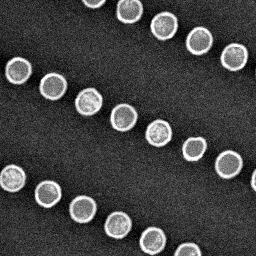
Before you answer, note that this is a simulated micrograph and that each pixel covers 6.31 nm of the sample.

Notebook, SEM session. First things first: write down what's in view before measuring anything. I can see a regular array of raised bodies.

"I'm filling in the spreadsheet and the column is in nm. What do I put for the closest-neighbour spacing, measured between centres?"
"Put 241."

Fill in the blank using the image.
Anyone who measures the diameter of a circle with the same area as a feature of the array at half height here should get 158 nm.